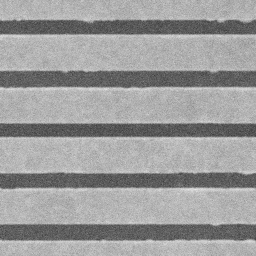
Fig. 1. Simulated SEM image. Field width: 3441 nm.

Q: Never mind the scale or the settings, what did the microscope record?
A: lines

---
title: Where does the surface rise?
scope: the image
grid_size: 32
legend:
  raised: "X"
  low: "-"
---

XXXXXXXXXXXXXXXXXXXXXXXXXXXXXXXX
XXXXXXXXXXXXXXXXXXXXXXXXXXXXXXXX
XXX-------XXXXX-----X-----X-----
--------------------------------
--------XXXXXXXX-XXX----XXXXXX--
XXXXXXXXXXXXXXXXXXXXXXXXXXXXXXXX
XXXXXXXXXXXXXXXXXXXXXXXXXXXXXXXX
XXXXXXXXXXXXXXXXXXXXXXXXXXXXXXXX
XXXXXXXXXXXXXXXXXXXXXXXXXXXXXXXX
--------------------------------
--------------------------------
XXXXXXXXXXXXXXXXXXXXXXXXXXXXXXXX
XXXXXXXXXXXXXXXXXXXXXXXXXXXXXXXX
XXXXXXXXXXXXXXXXXXXXXXXXXXXXXXXX
XXXXXXXXXXXXXXXXXXXXXXXXXXXXXXXX
--------------------------------
--------------------------------
XXXXXXXXXXXXXXXXXXXXXXXXXXXXXXXX
XXXXXXXXXXXXXXXXXXXXXXXXXXXXXXXX
XXXXXXXXXXXXXXXXXXXXXXXXXXXXXXXX
XXXXXXXXXXXXXXXXXXXXXXXXXXXXXXXX
XXXXXXX-XXXXXXXXXXXXXXXXXX---XXX
--------------------------------
--------------------------------
XXXXXXXXXXXXXXXXXXXXXXXXXXXXXXXX
XXXXXXXXXXXXXXXXXXXXXXXXXXXXXXXX
XXXXXXXXXXXXXXXXXXXXXXXXXXXXXXXX
XXXXXXXXXXXXXXXXXXXXXXXXXXXXXXXX
--------------------------------
--------------------------------
XXXXXXXXXXXXXXXXXXXXXXXXXXXXXXXX
XXXXXXXXXXXXXXXXXXXXXXXXXXXXXXXX